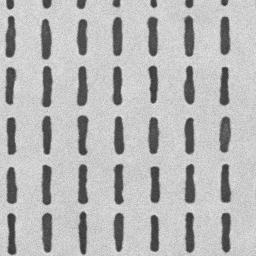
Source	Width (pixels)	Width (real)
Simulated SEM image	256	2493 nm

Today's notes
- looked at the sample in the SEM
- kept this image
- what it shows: a regular array of holes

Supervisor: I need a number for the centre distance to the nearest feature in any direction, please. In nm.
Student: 345